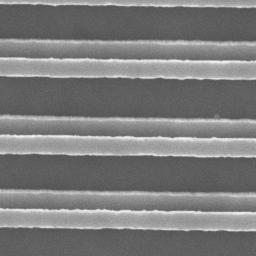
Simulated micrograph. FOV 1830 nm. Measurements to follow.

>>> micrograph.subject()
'lines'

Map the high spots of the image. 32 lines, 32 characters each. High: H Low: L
LLLLHHHHHHHHHHHHHHHHHHHHHHHHHHHH
LLLLLLLLLLLLLLLLLLLLLLLLLLLLLLLL
LLLLLLLLLLLLLLLLLLLLLLLLLLLLLLLL
LLLLLLLLLLLLLLLLLLLLLLLLLLLLLLLL
LLLLLLLLLLLLLLLLLLLLLLLLLLLLLLLL
HHHHHHHHHHHHHHHHHHHHHHHHHHHLLLLL
HHHHHHHHHHHHHHHHHHHHHHHHHHHHHHHH
HHHHHHHHHHHHHHHHHHHHHHHHHHHHHHHH
HHHHHHHHHHHHHHHHHHHHHHHHHHHHHHHH
LHHHHHHHHHHHHHHHHHHHHHHHHHHHHHHH
LLLLLLLLLLLLLLLLLLLLLLLLLLLLLLLL
LLLLLLLLLLLLLLLLLLLLLLLLLLLLLLLL
LLLLLLLLLLLLLLLLLLLLLLLLLLLLLLLL
LLLLLLLLLLLLLLLLLLLLLLLLLLLLLLLL
LLLLLLLLLLLLLLLLLLLLLLLLLLLLLLLL
HHHHHHHHHHHHHHHHHHHHHHHHHHHHHHHH
HHHHHHHHHHHHHHHHHHHHHHHHHHHHHHHH
HHHHHHHHHHHHHHHHHHHHHHHHHHHHHHHH
HHHHHHHHHHHHHHHHHHHHHHHHHHHHHHHH
LLLLLLLLLLLLLLLLLLLLLLLLHHHHHHHH
LLLLLLLLLLLLLLLLLLLLLLLLLLLLLLLL
LLLLLLLLLLLLLLLLLLLLLLLLLLLLLLLL
LLLLLLLLLLLLLLLLLLLLLLLLLLLLLLLL
LLLLLLLLLLLLLLLLLLLLLLLLLLLLLLLL
HHHHHHHHHHHHHHHHHHHHHHHHHHHHHHHH
HHHHHHHHHHHHHHHHHHHHHHHHHHHHHHHH
HHHHHHHHHHHHHHHHHHHHHHHHHHHHHHHH
HHHHHHHHHHHHHHHHHHHHHHHHHHHHHHHH
LLLLLLLLLLHHHLHHHHHHHHHHHHHHHHHH
LLLLLLLLLLLLLLLLLLLLLLLLLLLLLLLL
LLLLLLLLLLLLLLLLLLLLLLLLLLLLLLLL
LLLLLLLLLLLLLLLLLLLLLLLLLLLLLLLL